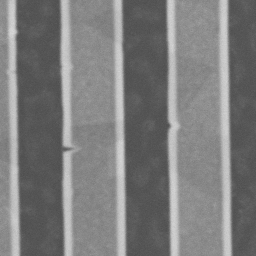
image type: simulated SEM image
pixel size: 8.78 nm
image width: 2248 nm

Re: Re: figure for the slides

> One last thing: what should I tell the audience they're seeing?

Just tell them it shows one or a few lines or trenches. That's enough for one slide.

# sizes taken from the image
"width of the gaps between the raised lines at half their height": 51.4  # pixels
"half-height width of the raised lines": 475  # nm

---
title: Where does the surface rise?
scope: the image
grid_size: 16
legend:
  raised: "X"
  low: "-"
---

X---XXX----XXX--
X---XXX----XXX--
X---XXX----XXX--
X---XXX----XXX--
X---XXX----XXX--
X---XXX----XXX--
X---XXX----XXX--
X---XXXX---XXX--
X---XXXX---XXX--
X---XXXX---XXX--
X---XXXX---XXX--
X---XXXX---XXX--
X---XXXX---XXX--
X---XXXX---XXX--
X---XXXX---XXX--
X---XXXX---XXX--